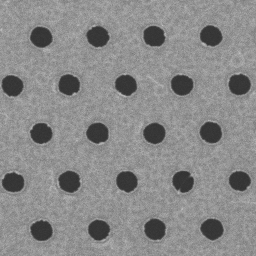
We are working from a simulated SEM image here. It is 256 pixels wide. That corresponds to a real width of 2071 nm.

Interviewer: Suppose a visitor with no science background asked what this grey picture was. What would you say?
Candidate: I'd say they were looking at a regular array of holes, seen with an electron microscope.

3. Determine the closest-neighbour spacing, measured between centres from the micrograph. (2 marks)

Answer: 0.449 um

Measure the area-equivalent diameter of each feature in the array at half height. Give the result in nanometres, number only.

175